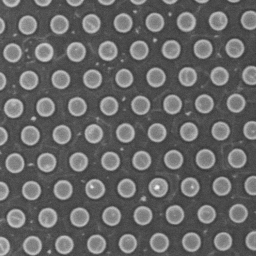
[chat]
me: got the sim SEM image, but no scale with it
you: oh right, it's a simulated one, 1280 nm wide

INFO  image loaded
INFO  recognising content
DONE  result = a regular array of raised bodies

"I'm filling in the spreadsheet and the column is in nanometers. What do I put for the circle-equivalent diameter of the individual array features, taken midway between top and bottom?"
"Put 92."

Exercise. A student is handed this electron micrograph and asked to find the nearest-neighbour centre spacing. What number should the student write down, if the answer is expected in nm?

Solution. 158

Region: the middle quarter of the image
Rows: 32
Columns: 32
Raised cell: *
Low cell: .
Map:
................................
..............**......**.....***
*....****....****....****....***
*....****....****....****....***
*....****....****....****....***
*.....***.....**......*.........
................................
................................
..........**......**......***...
.****....****....****....****...
.****....****....****....****...
.****....****....****....****...
..***.....**.......*............
................................
................................
......***.....***.....***.....**
*.....****...*****...****....***
**...*****...*****...*****...***
**....***.....***.....***.....**
*......*.......*................
................................
................................
...*......***.....***.....***...
..****...*****...****....*****..
.*****...*****...*****...*****..
..***.....***.....***.....***...
...**...........................
................................
................................
*.....***.....***.....****....**
**....****....****...*****...***
**...*****....****...*****...***